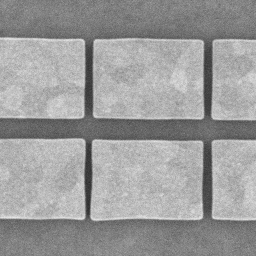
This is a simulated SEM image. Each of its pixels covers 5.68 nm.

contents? wiring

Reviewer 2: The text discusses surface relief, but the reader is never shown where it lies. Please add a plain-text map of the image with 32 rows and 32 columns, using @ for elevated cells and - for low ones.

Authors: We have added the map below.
--------------------------------
--------------------------------
--------------------------------
--------------------------------
--------------------------------
@@@@@@@@@@--@@@@@@@@@@@@@--@@@@@
@@@@@@@@@@@-@@@@@@@@@@@@@--@@@@@
@@@@@@@@@@@-@@@@@@@@@@@@@--@@@@@
@@@@@@@@@@@-@@@@@@@@@@@@@--@@@@@
@@@@@@@@@@@-@@@@@@@@@@@@@--@@@@@
@@@@@@@@@@--@@@@@@@@@@@@@--@@@@@
@@@@@@@@@@--@@@@@@@@@@@@@--@@@@@
@@@@@@@@@@--@@@@@@@@@@@@@--@@@@@
@@@@@@@@@@--@@@@@@@@@@@@@--@@@@@
@@@@@@@@@@--@@@@@@@@@@@@@--@@@@@
--------------------------------
--------------------------------
@@@@@@@@@@----------------------
@@@@@@@@@@@-@@@@@@@@@@@@@--@@@@@
@@@@@@@@@@@-@@@@@@@@@@@@@--@@@@@
@@@@@@@@@@@-@@@@@@@@@@@@@--@@@@@
@@@@@@@@@@--@@@@@@@@@@@@@--@@@@@
@@@@@@@@@@--@@@@@@@@@@@@@--@@@@@
@@@@@@@@@@--@@@@@@@@@@@@@--@@@@@
@@@@@@@@@@@@@@@@@@@@@@@@@--@@@@@
@@@@@@@@@@@@@@@@@@@@@@@@@--@@@@@
@@@@@@@@@@@@@@@@@@@@@@@@@--@@@@@
--------------------------------
--------------------------------
--------------------------------
--------------------------------
--------------------------------